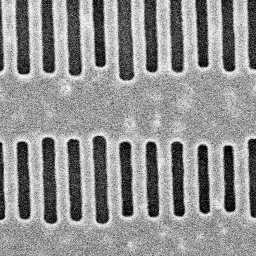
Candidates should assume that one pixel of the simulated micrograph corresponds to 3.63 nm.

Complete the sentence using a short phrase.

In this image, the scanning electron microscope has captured a regular array of holes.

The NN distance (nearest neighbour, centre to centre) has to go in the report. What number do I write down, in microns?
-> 0.093